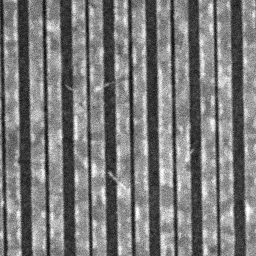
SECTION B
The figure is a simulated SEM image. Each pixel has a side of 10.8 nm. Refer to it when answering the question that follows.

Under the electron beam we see parallel lines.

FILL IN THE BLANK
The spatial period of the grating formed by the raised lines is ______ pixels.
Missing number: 21.3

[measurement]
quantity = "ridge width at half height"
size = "133 nanometres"